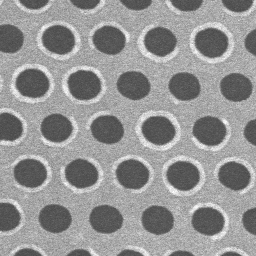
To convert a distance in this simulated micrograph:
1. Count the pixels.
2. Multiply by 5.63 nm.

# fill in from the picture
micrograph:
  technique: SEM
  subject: a regular array of holes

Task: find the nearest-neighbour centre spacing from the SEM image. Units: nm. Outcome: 286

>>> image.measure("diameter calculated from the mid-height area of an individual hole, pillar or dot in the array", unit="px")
31.5